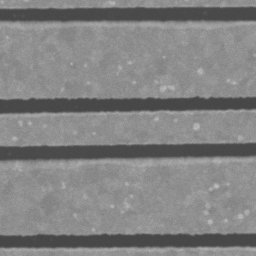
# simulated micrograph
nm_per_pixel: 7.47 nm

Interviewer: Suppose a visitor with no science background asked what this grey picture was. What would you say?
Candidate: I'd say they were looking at lines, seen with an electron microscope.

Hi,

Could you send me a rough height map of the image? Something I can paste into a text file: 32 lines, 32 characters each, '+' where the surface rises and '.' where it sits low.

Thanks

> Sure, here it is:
++++++++++++++++++++++++++++++++
................................
................................
++++++++++++++++++++++++++++++++
++++++++++++++++++++++++++++++++
++++++++++++++++++++++++++++++++
++++++++++++++++++++++++++++++++
++++++++++++++++++++++++++++++++
++++++++++++++++++++++++++++++++
++++++++++++++++++++++++++++++++
++++++++++++++++++++++++++++++++
++++++++++++++++++++++++++++++++
................................
................................
++++++++++++++++++++++++++++++++
++++++++++++++++++++++++++++++++
++++++++++++++++++++++++++++++++
++++++++++++++++++++++++++++++++
................................
................................
++++++++++++++++++++++++++++++++
++++++++++++++++++++++++++++++++
++++++++++++++++++++++++++++++++
++++++++++++++++++++++++++++++++
++++++++++++++++++++++++++++++++
++++++++++++++++++++++++++++++++
++++++++++++++++++++++++++++++++
++++++++++++++++++++++++++++++++
++++++++++++++++++++++++++++++++
................................
................................
++++++++++++++++++++++++++++++++